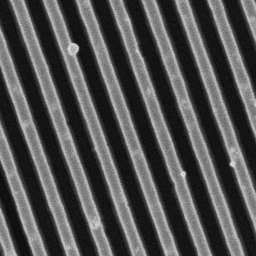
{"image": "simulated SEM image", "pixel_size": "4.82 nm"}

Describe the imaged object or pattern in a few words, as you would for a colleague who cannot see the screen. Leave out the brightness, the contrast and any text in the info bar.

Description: parallel lines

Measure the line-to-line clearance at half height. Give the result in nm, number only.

79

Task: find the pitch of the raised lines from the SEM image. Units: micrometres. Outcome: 0.149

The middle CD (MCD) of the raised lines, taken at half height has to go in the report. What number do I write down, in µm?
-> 0.0694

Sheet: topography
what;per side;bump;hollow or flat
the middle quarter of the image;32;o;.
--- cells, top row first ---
oooo.....ooo.....oooo....oooo...
.oooo....oooo....oooo....oooo...
.oooo....oooo....oooo.....ooo...
.oooo....oooo.....oooo....oooo..
..ooo.....oooo....oooo.....ooo..
..oooo....oooo.....ooo.....oooo.
...ooo.....oooo....oooo....oooo.
...ooo.....oooo....oooo....oooo.
...oooo....oooo.....ooo.....oooo
...oooo.....ooo.....oooo....oooo
....oooo....oooo....oooo....oooo
....oooo....oooo.....ooo.....ooo
....oooo.....oooo....oooo....ooo
.....oooo....oooo....oooo....ooo
o....oooo.....ooo.....oooo....oo
o.....ooo.....oooo....oooo....oo
o.....oooo....oooo....oooo.....o
oo....oooo.....ooo.....oooo....o
oo.....ooo.....oooo....oooo....o
ooo....oooo....oooo....oooo.....
ooo....oooo.....ooo.....oooo....
ooo.....ooo.....oooo....oooo....
oooo....oooo....oooo....oooo....
oooo.....ooo.....ooo.....oooo...
oooo.....oooo....oooo....oooo...
.oooo....oooo....oooo.....ooo...
.oooo.....ooo....ooooo....oooo..
..ooo.....oooo....oooo....oooo..
..oooo....oooo....oooo.....ooo..
..oooo....oooo.....oooo....oooo.
...ooo.....oooo....oooo.....ooo.
...oooo....oooo....oooo.....ooo.